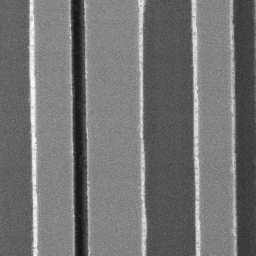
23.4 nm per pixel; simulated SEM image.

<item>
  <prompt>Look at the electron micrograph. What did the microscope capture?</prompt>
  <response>lines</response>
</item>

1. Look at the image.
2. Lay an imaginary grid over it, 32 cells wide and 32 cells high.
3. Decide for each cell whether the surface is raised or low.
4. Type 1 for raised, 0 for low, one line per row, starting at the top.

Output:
00001111101111111000000011111000
00001111101111111000000011111000
00001111101111111000000011111000
00001111100111111000000011111000
00001111100111111000000011111000
00001111100111111100000011111000
00001111100111111100000011111000
00001111100111111100000011111000
00001111100111111100000011111000
00001111100111111100000001111000
00001111100111111100000001111000
00001111100111111100000001111000
00001111100111111100000001111000
00001111100111111100000001111000
00001111100111111100000001111000
00001111100111111100000001111000
00001111100111111100000001111000
00001111100111111100000001111000
00001111100111111100000001111000
00001111100111111100000001111000
00001111100111111100000001111000
00001111100111111100000001111000
00000111100111111100000001111000
00000111100111111100000001111000
00000111100111111100000001111000
00000111100111111100000001111000
00000111100111111100000001111000
00000111100111111100000001111000
00000111100111111100000001111000
00000111100111111100000001111000
00000111100111111100000001111000
00000111100111111100000001111000